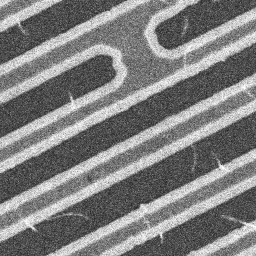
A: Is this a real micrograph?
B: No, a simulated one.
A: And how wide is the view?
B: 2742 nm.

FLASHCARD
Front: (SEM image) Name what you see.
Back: one or a few lines or trenches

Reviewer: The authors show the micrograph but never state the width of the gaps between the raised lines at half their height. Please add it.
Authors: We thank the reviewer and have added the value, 421 nm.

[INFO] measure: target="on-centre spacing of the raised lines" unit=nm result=670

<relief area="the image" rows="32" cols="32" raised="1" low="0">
11111100000000001111111000000000
11100000000000111111100000000000
11000000000011111111000000000011
00000000001111111110000000001111
00000000011111111110000000111111
00000011111111111110000011111100
00000111111000111111001111110000
00011111100000011111111111000000
01111111000000011111111110000000
11111100000000011111110000000000
11110000000000111111000000000001
11000000000001111110000000000111
00000000000111111000000000011111
00000000011111100000000001111110
00000001111110000000000111111000
00000111111000000000011111100000
00011111100000000001111111000000
01111110000000000111111100000000
11111000000000011111110000000000
11100000000001111111000000000001
10000000000111111100000000000111
00000000011111110000000000011111
00000001111111000000000000111111
00000111111100000000000011111100
00011111110000000000001111110000
01111111000000000000111111000000
11111100000000000011111100000000
11110000000000001111110000000000
11000000000000111111000000000001
00000000000011111100000000000111
00000000001111110000000000011111
00000000111111000000000001111110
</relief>